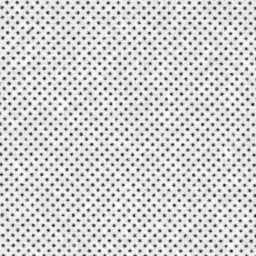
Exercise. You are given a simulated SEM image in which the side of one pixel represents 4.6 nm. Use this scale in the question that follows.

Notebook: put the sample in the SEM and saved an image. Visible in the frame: a regular array of holes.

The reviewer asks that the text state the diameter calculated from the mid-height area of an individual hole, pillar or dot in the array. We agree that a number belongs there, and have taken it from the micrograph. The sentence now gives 16.4 nm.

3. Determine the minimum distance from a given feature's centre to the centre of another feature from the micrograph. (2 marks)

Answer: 31.2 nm